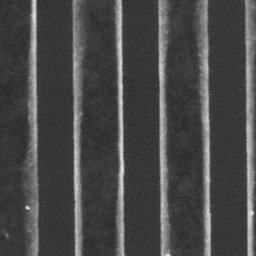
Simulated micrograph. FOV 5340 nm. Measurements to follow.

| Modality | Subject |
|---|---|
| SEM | lines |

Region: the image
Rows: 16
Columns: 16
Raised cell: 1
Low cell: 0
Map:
1100011000111000
1100011000111000
1100011000111000
1100011100111000
1100011100111000
1100011100111000
1100011100111000
1100011100111000
1100011100111000
1100011100111000
1100011100111000
1100011100111000
1100011100111000
1100011100111000
1100011100111000
1100011100111000